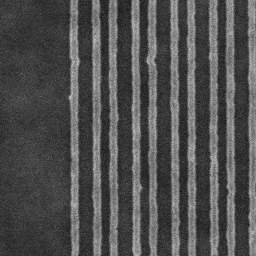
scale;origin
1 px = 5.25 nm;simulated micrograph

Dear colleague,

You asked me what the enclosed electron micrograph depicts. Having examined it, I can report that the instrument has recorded parallel lines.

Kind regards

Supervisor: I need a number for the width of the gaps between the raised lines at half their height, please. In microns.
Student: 0.0754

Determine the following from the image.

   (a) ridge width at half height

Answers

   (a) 0.0354 um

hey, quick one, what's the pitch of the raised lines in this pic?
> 103 nanometres